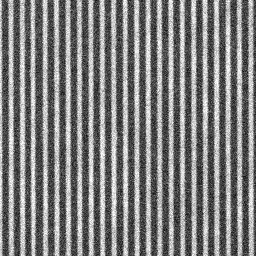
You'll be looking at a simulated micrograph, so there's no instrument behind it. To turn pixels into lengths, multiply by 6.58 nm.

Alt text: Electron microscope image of parallel lines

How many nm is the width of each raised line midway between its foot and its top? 27.2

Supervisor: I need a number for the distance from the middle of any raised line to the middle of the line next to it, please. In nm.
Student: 75.2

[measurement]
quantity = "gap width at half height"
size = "51 nm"